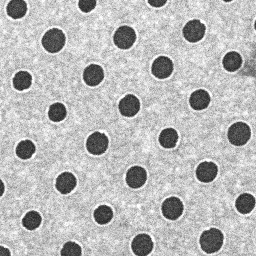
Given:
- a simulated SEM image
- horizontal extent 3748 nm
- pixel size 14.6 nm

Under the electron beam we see a regular array of holes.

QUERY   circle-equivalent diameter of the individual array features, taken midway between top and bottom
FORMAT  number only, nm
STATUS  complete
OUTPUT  336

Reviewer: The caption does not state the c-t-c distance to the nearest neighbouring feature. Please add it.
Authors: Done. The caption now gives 717 nanometres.